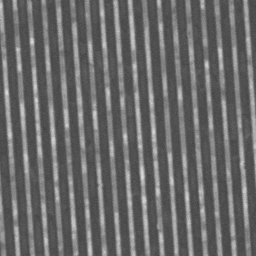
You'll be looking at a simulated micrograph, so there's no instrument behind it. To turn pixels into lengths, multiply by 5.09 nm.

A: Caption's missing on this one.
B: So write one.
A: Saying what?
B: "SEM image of parallel lines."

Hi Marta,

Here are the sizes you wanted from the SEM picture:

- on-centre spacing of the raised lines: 73.2 nm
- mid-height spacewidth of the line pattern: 53.9 nanometers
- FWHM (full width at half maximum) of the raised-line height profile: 19.7 nm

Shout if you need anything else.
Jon